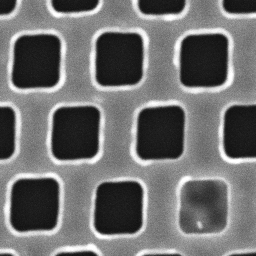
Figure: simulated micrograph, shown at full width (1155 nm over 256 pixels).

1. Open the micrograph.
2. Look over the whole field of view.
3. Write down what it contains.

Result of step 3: holes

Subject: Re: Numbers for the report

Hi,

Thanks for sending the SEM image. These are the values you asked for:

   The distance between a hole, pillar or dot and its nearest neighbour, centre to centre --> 374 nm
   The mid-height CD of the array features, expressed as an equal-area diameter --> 252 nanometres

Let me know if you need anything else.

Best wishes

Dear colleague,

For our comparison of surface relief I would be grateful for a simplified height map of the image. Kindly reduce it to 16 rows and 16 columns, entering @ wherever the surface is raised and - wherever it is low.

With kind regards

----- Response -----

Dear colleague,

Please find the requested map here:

-@@---@@@--@@@--
@@@@@@@@@@@@@@@@
@---@@---@@---@@
@---@@---@@---@@
@---@@---@@---@@
@--@@@@@@@@@@@@@
@@@@@@@@@@@@@@@@
-@@---@@@---@@--
-@@---@@@---@@--
-@@---@@@--@@@--
@@@@@@@@@@@@@@@@
@---@@---@@@@@@@
@---@@---@@@@@@@
@---@@---@@@@@@@
@@@@@@--@@@@@@@@
@@@@@@@@@@@@@@@@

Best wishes